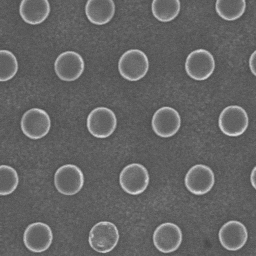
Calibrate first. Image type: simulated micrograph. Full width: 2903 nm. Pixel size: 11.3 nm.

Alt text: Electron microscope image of a regular array of raised bodies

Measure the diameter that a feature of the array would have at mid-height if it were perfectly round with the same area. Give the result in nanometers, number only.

334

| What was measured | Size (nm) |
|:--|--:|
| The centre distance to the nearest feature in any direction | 738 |